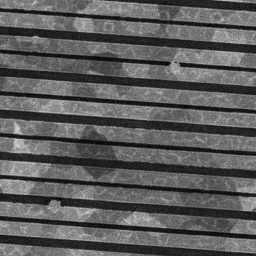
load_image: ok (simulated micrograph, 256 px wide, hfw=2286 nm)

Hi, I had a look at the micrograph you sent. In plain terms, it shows parallel lines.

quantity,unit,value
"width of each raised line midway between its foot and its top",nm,124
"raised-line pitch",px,20.7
